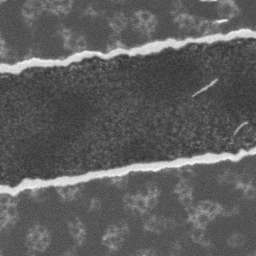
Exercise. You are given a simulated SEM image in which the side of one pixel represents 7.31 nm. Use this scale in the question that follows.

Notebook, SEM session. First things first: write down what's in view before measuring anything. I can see one or a few lines or trenches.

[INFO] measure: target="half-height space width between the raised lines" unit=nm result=866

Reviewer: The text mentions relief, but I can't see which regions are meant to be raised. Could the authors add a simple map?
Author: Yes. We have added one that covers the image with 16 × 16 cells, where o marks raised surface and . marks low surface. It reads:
oooooooooooooooo
oooooooooooooooo
ooooooooooooo...
ooooo...........
................
................
................
................
................
...............o
........oooooooo
..oooooooooooooo
oooooooooooooooo
oooooooooooooooo
oooooooooooooooo
oooooooooooooooo